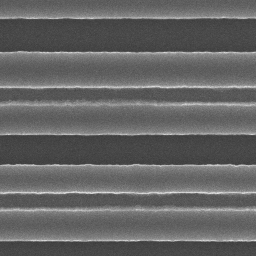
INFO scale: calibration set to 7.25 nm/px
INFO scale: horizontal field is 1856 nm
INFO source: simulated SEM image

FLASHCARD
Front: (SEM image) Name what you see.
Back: lines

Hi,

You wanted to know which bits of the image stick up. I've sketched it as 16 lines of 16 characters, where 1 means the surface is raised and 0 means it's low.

1111111111111111
0000000000000000
0000000000000000
1111111111111111
1111111111111111
1111111111111111
1111111111111111
1111111111111111
0000000000000000
0000000000000000
1111111111111111
1111111111111111
1111111111111111
1111111111111111
1111111111111111
0000000000000000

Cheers